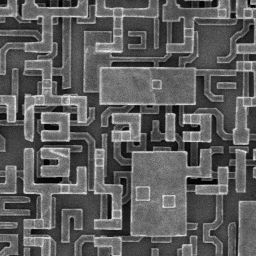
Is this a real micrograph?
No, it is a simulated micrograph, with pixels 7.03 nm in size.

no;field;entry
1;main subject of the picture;wiring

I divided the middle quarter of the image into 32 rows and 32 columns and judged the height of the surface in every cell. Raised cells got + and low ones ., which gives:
................................
.........+++++++++++++++++++++++
.........+++++++++++++++++++++++
.........+++++++++++++++++++++++
.........+++++++++++++++++++++++
.........+++++++++++++++++++++++
.........+++++++++++++++++++++++
.........+++++++++++++++++++++++
++++++...+++++++++++++++++++++++
++++++...+++++++++++++++++++++++
...+++..........................
...+++..........................
+..+++......+++++++.......+.....
+..+++......+++++++......+++..++
+..+++......+++++++......+++..++
+...............+++......+++....
+...............+++......+++....
+...........+++++++......+++..++
+...........+++++++......+++..++
................................
................................
+.......++......................
+.......++.......++++++++++++++.
+.......++.......++++++++++++++.
+.......++.......++++++++++++++.
+.......++.......++++++++++++++.
+..+++..++.......+++++++++++++++
+..+++..++.......+++++++++++++++
...+++..++.......++++++++++++++.
...+++..++.......++++++++++++++.
++++++..+++++++..++++++++++++++.
++++++..+++++++..++++++++++++++.